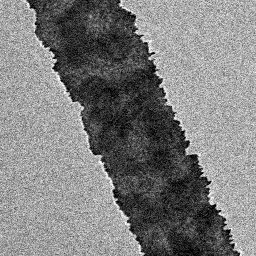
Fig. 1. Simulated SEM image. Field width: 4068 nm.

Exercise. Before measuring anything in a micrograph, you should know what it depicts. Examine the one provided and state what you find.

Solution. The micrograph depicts one or a few lines or trenches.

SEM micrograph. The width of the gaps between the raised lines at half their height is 1380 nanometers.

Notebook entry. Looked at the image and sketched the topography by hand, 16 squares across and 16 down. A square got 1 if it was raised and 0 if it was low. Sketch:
1100000011111111
1100000001111111
1100000001111111
1110000001111111
1110000000111111
1111000000111111
1111100000011111
1111100000011111
1111100000001111
1111110000001111
1111110000000111
1111111000000111
1111111000000111
1111111100000011
1111111100000011
1111111110000001